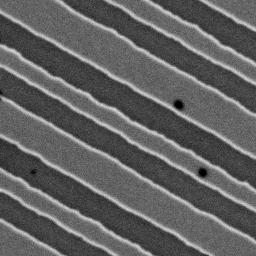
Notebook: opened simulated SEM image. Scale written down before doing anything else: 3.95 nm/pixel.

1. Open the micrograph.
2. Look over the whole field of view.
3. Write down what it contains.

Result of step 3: lines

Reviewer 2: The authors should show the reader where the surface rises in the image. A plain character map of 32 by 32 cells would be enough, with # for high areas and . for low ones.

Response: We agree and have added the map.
########......#####.......######
##########......#####.......####
..#########......######......###
...##########......######......#
.....##########......#####......
.......##########......#####....
##.......#########......######..
###.......##########......#####.
#####.......##########......####
..#####.......##########......##
....####........#########.......
......####.......##########.....
#......#####.......##########...
###......#####.......##########.
#####......#####.......#########
######.......####.......########
########.......####.......######
.#########......#####.......####
...#########......#####......###
.....#########......#####......#
......#########......#####......
#.......#########......#####....
###.......#########......#####..
####.......#########.......#####
.#####.......#########......####
...#####.......#########......##
.....#####......#########.......
.......#####......#########.....
##......#####.......#########...
####......#####.......#########.
#####......######......#########
#######......#####.......#######